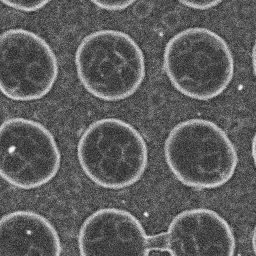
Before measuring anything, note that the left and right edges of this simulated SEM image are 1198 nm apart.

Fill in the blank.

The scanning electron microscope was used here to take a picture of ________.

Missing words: raised bodies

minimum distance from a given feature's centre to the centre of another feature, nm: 414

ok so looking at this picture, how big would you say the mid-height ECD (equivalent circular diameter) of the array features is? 311 nanometers